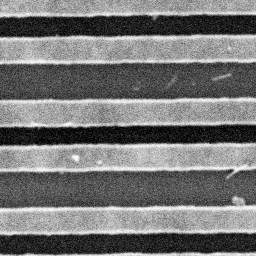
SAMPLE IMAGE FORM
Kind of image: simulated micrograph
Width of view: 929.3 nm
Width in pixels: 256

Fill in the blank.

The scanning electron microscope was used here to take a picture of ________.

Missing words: lines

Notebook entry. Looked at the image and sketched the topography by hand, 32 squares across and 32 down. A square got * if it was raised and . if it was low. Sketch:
********************************
********************************
................................
................................
........................*****.*.
********************************
********************************
********************************
................................
................................
................................
................................
......................**********
********************************
********************************
****************************....
................................
................................
********************************
********************************
********************************
................................
................................
................................
................................
................................
********************************
********************************
********************************
................................
................................
................................